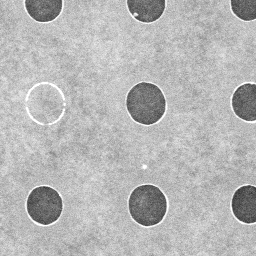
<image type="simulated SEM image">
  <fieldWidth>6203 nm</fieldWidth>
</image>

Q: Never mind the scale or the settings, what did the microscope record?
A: holes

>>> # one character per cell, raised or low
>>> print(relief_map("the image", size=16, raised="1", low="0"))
1100111100111110
1111111111111111
1111111111111111
1111111111111111
1111111111111111
1111111100111110
1111111100111100
1111111100111110
1111111111111111
1111111111111111
1111111111111111
1111111111111111
1100111100111110
1100111100111110
1111111111111111
1111111111111111